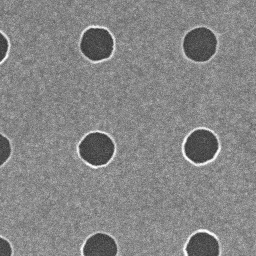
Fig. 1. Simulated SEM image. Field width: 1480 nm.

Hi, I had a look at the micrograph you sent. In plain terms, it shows holes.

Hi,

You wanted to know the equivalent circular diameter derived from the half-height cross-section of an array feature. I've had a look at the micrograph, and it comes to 200 nm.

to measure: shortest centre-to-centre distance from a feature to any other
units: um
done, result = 0.591